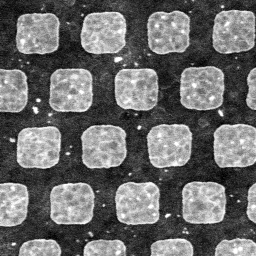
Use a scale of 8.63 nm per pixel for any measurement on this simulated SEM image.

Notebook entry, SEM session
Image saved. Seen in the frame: a regular array of raised bodies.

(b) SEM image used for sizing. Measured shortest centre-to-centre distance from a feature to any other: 561 nanometres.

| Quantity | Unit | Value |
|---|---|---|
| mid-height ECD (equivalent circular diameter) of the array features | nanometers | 391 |